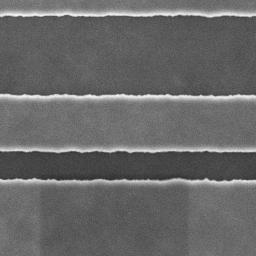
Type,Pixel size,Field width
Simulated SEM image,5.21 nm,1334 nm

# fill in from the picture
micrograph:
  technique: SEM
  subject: lines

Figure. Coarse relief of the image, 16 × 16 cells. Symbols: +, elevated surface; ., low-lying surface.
++++++++++++++++
................
................
................
................
................
++++++++++++++++
++++++++++++++++
++++++++++++++++
................
................
++++++++++++++++
++++++++++++++++
++++++++++++++++
++++++++++++++++
++++++++++++++++